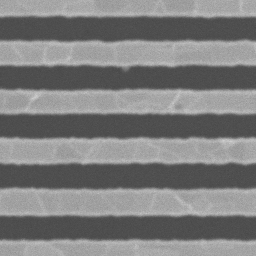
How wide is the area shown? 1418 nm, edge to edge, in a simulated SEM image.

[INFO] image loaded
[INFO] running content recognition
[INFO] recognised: lines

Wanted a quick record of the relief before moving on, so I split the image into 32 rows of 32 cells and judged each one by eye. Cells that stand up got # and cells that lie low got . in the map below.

################################
################################
................................
................................
................................
################################
################################
################################
................................
................................
................................
################################
################################
################################
................................
................................
................................
################################
################################
################################
..#.##....#................#..#.
................................
................................
................................
################################
################################
################################
................................
................................
................................
################################
################################